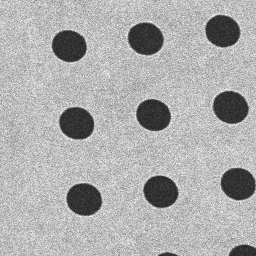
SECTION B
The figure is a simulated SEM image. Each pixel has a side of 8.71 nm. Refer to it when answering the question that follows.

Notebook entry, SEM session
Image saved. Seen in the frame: a regular array of holes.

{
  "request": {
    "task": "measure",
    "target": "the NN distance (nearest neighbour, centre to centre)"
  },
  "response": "76.7 pixels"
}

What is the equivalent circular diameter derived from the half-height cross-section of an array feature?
295 nm